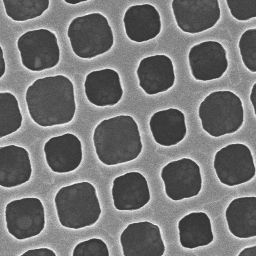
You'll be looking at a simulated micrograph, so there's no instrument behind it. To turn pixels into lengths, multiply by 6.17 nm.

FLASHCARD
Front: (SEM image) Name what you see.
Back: a regular array of holes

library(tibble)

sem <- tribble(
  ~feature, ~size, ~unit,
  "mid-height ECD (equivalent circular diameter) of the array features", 247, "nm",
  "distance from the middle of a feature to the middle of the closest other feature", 328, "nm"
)